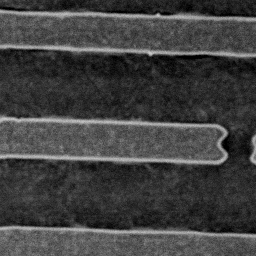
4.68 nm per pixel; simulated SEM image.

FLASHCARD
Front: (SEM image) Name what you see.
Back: one or a few lines or trenches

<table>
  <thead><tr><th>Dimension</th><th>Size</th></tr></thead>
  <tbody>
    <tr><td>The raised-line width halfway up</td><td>177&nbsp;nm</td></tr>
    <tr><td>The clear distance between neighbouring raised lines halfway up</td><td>0.332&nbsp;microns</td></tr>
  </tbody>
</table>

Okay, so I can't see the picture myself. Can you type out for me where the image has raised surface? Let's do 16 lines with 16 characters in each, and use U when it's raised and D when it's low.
DDDDDDDDDDDDDDDD
UUUUUUUUUUUUUUUU
UUUUUUUUUUUUUUUU
DDDDDDDDDDDDDDDU
DDDDDDDDDDDDDDDD
DDDDDDDDDDDDDDDD
DDDDDDDDDDDDDDDD
UUUDDDDDDDDDDDDD
UUUUUUUUUUUUUUDD
UUUUUUUUUUUUUUDD
DDDDDDDDDDDDDDDD
DDDDDDDDDDDDDDDD
DDDDDDDDDDDDDDDD
DDDDDDDDDDDDDDDD
UUUUUUUUUUUUDDDD
UUUUUUUUUUUUUUUU